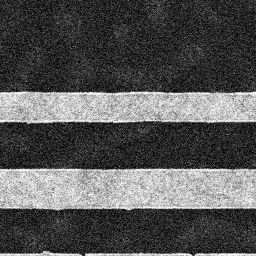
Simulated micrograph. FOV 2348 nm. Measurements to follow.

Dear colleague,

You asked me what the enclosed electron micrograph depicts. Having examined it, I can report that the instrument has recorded one or a few lines or trenches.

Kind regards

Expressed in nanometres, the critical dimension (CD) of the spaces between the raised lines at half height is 430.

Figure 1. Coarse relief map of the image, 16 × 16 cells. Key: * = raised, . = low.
................
................
................
................
................
................
****************
****************
................
................
................
****************
****************
................
................
................